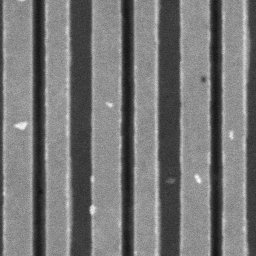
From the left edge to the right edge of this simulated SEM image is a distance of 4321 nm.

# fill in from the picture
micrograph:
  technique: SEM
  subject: lines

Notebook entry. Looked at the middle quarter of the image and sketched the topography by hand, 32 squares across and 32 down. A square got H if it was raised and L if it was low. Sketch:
HLLLLLLHHHHHHHLLLLHHHHHLLLLLLHHH
HLLLLLLHHHHHHHLLLLHHHHHLLLLLLHHH
HLLLLLLHHHHHHHLLLLHHHHHLLLLLLHHH
HLLLLLLHHHHHHHLLLLHHHHHLLLLLLHHH
HLLLLLLHHHHHHHLLLLHHHHHLLLLLLHHH
HLLLLLLHHHHHHHLLLLHHHHHLLLLLLHHH
HLLLLLLHHHHHHHLLLLHHHHHLLLLLLHHH
HLLLLLLHHHHHHHLLLLHHHHHLLLLLLHHH
HLLLLLLHHHHHHHLLLLHHHHHLLLLLLHHH
HLLLLLLHHHHHHHLLLLHHHHHLLLLLLHHH
HLLLLLLHHHHHHHLLLLHHHHHLLLLLLHHH
HLLLLLLHHHHHHHLLLLHHHHHLLLLLLHHH
HLLLLLLHHHHHHHLLLLHHHHHLLLLLLHHH
HLLLLLLHHHHHHHLLLLHHHHHLLLLLLHHH
HLLLLLLHHHHHHHLLLLHHHHHLLLLLLHHH
HLLLLLLHHHHHHHLLLLHHHHHLLLLLLHHH
HLLLLLLHHHHHHHLLLLHHHHHLLLLLLHHH
HLLLLLLHHHHHHHLLLLHHHHHLLLLLLHHH
HLLLLLLHHHHHHHLLLLHHHHHLLLLLLHHH
HLLLLLLHHHHHHHLLLLHHHHHLLLLLLHHH
HLLLLLLHHHHHHHLLLLHHHHHLLLLLLHHH
HLLLLLLHHHHHHHLLLLHHHHHLLLLLLHHH
HLLLLLLHHHHHHHLLLLHHHHHLLLLLLHHH
HLLLLLLHHHHHHHLLLLHHHHHLLLLLLHHH
HLLLLLLHHHHHHHLLLLHHHHHLLLLLLHHH
HLLLLLLHHHHHHHLLLLHHHHHLLLLLLHHH
HLLLLLLHHHHHHHLLLLHHHHHLLLLLLHHH
HLLLLLLHHHHHHHLLLLHHHHHLLLLLLHHH
HLLLLLLHHHHHHHLLLLHHHHHLLLLLLHHH
HLLLLLLHHHHHHHLLLLHHHHHLLLLLLHHH
HLLLLLLHHHHHHHLLLLHHHHHLLLLLLHHH
HLLLLLLHHHHHHHLLLLHHHHHLLLLLLHHH